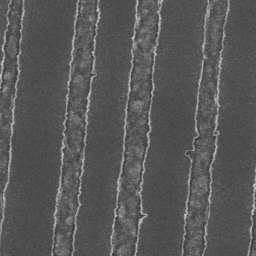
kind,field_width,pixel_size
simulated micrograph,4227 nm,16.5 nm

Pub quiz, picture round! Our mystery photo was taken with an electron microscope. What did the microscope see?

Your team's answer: one or a few lines or trenches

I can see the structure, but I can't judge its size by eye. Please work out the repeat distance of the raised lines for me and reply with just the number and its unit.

1100 nm